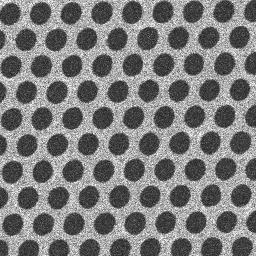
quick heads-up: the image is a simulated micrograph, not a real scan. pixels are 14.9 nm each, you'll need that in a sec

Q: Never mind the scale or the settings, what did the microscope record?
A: a regular array of holes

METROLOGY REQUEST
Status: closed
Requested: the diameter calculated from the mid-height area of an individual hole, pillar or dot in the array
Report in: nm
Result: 328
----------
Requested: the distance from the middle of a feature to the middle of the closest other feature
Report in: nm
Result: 449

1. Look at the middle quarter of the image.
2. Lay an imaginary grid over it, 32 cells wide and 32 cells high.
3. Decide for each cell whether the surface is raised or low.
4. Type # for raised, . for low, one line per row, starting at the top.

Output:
.....##.....###.....##......##..
....###.....###....###.....###..
....####...####....####...#####.
#########.######################
#####..######..#####...####....#
.###....###.....###.....##.....#
.##......##.....###.....##.....#
.##.....###.....###....###.....#
####....###.....###....####...##
####...#####...#############.###
#########################.######
#...####....####....###....####.
.....##.....###.....###.....##..
.....##.....###.....##......##..
....###.....###.....##.....###..
....####...####....####....####.
#########.######################
#####..######..#####...#####...#
.###....####....###.....###....#
.##......##.....###.....##......
.##......##.....###.....##.....#
.##.....###.....###....####....#
####...#####...#####..######..##
#########################.######
#...#####...####....####...####.
.....###.....##.....###.....##..
.....##......##.....##......##..
.....##.....###.....###.....##..
....####....###....####....####.
#.######...#####################
######.######..######..#####..##
.####...####....####....###.....